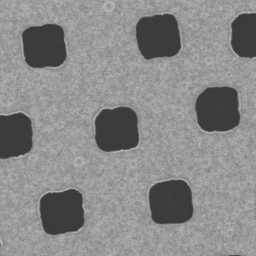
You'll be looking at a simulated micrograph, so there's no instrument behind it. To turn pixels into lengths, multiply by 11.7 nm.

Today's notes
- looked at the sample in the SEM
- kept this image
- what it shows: holes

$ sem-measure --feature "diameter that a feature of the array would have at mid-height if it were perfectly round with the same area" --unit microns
0.546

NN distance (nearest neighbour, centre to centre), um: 1.1